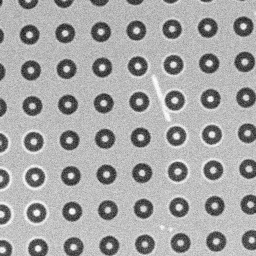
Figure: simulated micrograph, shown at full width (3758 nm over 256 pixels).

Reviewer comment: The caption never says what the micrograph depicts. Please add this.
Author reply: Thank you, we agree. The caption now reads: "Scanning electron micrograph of an array of small figures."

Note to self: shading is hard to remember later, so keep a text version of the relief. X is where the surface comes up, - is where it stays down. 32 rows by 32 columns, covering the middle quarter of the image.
---XXXX--X--XXXX--X--XXXX--X--XX
X--XXXX-----XXXX-----XXXX-----XX
---XXXXX----XXXXX---XXXXXX---XXX
--XXXXXXX-XXXXXXXXXXXXXXXXXXXXXX
XXXXXXXXXXXXXXXXXXXXXXXXXXXXXXXX
XXXXXXXXXXXXXXXXXXXXXXXXXXXXXXXX
XXXXXXXXXXXXXXXXXXXXXXXXXXX--XXX
XXXXXXXXX--XXXXXX----XXXX-----XX
---XXXXX----XXXX-----XXXX-----XX
---XXXX-----XXXX--X---XXX-----XX
----XXX-----XXXX-----XXXX-----XX
---XXXXX----XXXXX----XXXXX---XXX
--XXXXXXXXXXXXXXXXXXXXXXXXXXXXXX
XXXXXXXXXXXXXXXXXXXXXXXXXXXXXXXX
XXXXXXXXXXXXXXXXXXXXXXXXXXXXXXXX
XXXXXXXXXXXXXXXXXXXXXXXXXXX--XXX
X-XXXXXXX---XXXXX----XXXXX----XX
---XXXXX-----XXXX-----XXX------X
----XXXX--X--XXXX--X--XXX------X
-X--XXXX-----XXXX-----XXXX----XX
----XXXX----XXXXXX---XXXXXX--XXX
--XXXXXXXXXXXXXXXXXXXXXXXXXXXXXX
XXXXXXXXXXXXXXXXXXXXXXXXXXXXXXXX
XXXXXXXXXXXXXXXXXXXXXXXXXXXXXXXX
XXXXXXXXXXXXXXXXXXXXXXXXXXX---XX
X--XXXXXX---XXXXXX---XXXXX-----X
----XXXX-----XXXX-----XXXX--X--X
----XXXX--X--XXXX--X--XXXX-----X
----XXXX-----XXXX-----XXXX-----X
----XXXXX---XXXXXX---XXXXXXX--XX
X-XXXXXXXXXXXXXXXXXXXXXXXXXXXXXX
XXXXXXXXXXXXXXXXXXXXXXXXXXXXXXXX